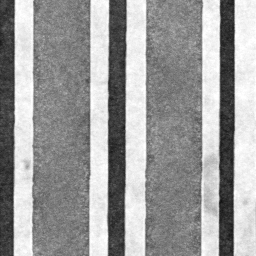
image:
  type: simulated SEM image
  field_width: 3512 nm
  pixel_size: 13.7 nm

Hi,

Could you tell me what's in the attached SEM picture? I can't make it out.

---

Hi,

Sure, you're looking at lines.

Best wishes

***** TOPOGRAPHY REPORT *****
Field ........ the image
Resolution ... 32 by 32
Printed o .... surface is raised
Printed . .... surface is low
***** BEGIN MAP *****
..oo.......ooo..oo.......oo..ooo
..oo.......ooo..oo.......oo..ooo
..oo.......ooo..oo.......ooo.ooo
..oo.......ooo..oo.......oo..ooo
..oo.......ooo..oo.......oo..ooo
..oo.......ooo..oo.......oo..ooo
..oo.......ooo..oo.......oo..ooo
..oo.......ooo..oo.......oo..ooo
..oo.......ooo..oo.......oo..ooo
..oo.......oo...oo.......oo..ooo
..oo.......oo...oo.......oo..ooo
..oo.......ooo..oo.......oo..ooo
..oo.......oo...oo.......oo..ooo
..oo.......oo...oo.......oo..ooo
..oo.......oo...oo.......oo..ooo
..oo.......oo...oo.......oo..ooo
..oo.......oo...oo.......oo..ooo
..oo.......oo...oo.......oo..ooo
..oo.......oo...oo.......oo..ooo
..oo.......oo...oo.......oo..ooo
..oo.......oo...oo.......oo..ooo
..oo.......oo...oo.......oo..ooo
..oo.......oo...oo.......oo..ooo
..oo.......oo...oo.......oo..ooo
..oo.......oo...oo.......oo..ooo
..oo.......oo...oo.......oo..ooo
..oo.......oo...oo.......oo..ooo
..oo.......oo...oo.......oo..ooo
..oo.......oo...oo.......oo..ooo
..oo.......oo...oo.......oo..ooo
..oo.......oo...oo.......oo..ooo
..oo.......oo...oo.......oo..ooo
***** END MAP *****